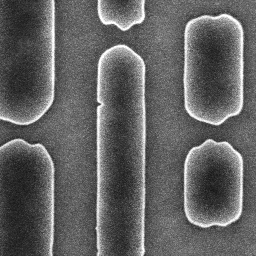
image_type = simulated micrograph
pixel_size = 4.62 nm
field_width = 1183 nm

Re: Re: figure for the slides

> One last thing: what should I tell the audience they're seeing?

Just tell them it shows one or a few lines or trenches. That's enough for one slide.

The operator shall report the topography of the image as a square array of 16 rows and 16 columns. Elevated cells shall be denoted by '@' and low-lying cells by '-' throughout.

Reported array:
@@@---@@@-------
@@@----@----@@@-
@@@---------@@@-
@@@---@@@---@@@-
@@@---@@@---@@@-
@@@---@@@---@@@-
@@@---@@@---@@@-
@@----@@@----@--
------@@@-------
@@@---@@@---@@@-
@@@---@@@---@@@-
@@@---@@@---@@@-
@@@---@@@---@@@-
@@@---@@@---@@@-
@@@---@@@-------
@@@---@@@-------